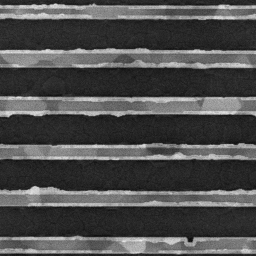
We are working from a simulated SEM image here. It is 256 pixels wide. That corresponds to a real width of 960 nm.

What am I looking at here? parallel lines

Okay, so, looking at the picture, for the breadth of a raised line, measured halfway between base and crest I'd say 57.1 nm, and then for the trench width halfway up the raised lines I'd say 116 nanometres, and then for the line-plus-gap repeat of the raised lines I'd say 175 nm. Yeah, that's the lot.